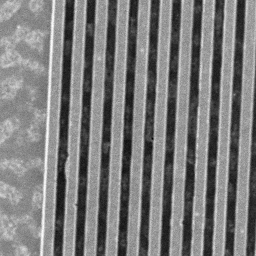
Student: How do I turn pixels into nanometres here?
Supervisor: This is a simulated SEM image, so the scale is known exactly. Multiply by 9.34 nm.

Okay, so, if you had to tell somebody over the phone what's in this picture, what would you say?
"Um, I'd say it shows parallel lines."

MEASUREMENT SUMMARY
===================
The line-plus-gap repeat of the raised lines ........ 200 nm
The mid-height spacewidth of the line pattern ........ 99.1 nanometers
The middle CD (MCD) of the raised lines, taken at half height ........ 99.1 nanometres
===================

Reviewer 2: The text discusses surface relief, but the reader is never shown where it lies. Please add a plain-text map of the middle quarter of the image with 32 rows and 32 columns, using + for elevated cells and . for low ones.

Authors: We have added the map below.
..+++...++...++...+++..+++...++.
..+++...++...++...+++..+++...++.
..+++..+++...++...++....++...++.
..+++..+++...++...++...+++...++.
..+++..+++...++...++...+++...++.
..++...+++...++...++...+++...++.
..++...+++...++...++...+++...++.
..++...+++...++...++...+++...++.
..++...+++..+++...++...+++...++.
..++...+++..+++...++...+++..+++.
..++...+++..+++...++...+++..+++.
..++...++...+++...++...+++..+++.
.+++...++...+++...++...++...+++.
.+++...++...+++...++...++...+++.
.+++...++...+++..+++...++...+++.
.+++...++...+++..+++...++...+++.
.+++...++...+++..+++...++...+++.
.+++...++...+++..+++...++...+++.
.+++...++...+++..+++...++...++..
.+++...++...+++..+++...++...++..
.+++...++...+++..+++..+++...++..
.+++...++...++...+++..+++...++..
.+++...++...++...+++..+++...++..
.+++..+++...++...++...+++...++..
.+++..+++...++...++...+++...++..
++++..+++...++...++...+++...++..
+++...+++...++...++...+++...++..
+++...+++...++...++...+++...++..
.++...+++...++...++...+++...++..
.++...+++..+++...++...+++...++..
.++...+++..+++...++...+++..+++..
.++...+++..+++...++...+++..+++..